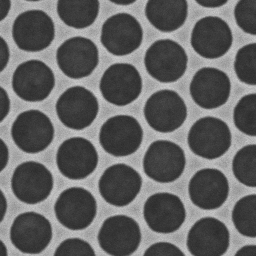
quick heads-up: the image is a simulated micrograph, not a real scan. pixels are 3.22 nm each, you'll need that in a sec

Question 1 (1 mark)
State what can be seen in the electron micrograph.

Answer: a regular array of holes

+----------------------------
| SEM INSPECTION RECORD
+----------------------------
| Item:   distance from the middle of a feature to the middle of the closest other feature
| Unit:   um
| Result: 0.161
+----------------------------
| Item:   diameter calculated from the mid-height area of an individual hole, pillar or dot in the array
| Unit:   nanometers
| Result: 134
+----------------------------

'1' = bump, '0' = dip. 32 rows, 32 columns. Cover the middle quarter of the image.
00000000111100000111000000000001
00000001111000000011100000000011
00000001110000000001100000000011
11001111100000000001111000000111
11111111100000000001111100111111
11111111100000000001111111111111
10000011100000000001111110111110
00000001110000000001110000001111
00000000110000000011100000000111
00000000111000000111100000000011
00000000011111111111000000000011
00000000011111111111000000000001
00000000111111111111000000000001
00000000111100000111000000000011
00000001110000000011100000000011
10000011100000000001110000000111
11111111100000000000111000001110
11111111100000000000111111111110
11000111100000000001111111111110
00000011100000000001110000011110
00000001100000000001100000000110
00000000110000000011100000000011
00000000111100000111000000000011
00000000011111111111000000000011
00000000111111111111000000000011
00000000111100001111000000000011
00000001110000000011000000000011
00000001110000000001100000000111
10000111100000000001110000001111
11111111100000000001111100011110
11111111100000000001111111111110
00000011100000000001111111111110